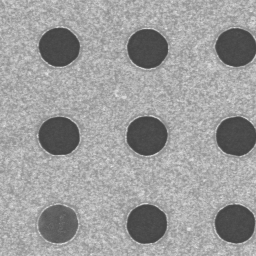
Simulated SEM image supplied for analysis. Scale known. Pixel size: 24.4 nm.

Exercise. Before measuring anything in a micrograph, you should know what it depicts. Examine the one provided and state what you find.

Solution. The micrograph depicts holes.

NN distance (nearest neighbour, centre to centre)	2140	nm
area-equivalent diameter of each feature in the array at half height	977	nanometres